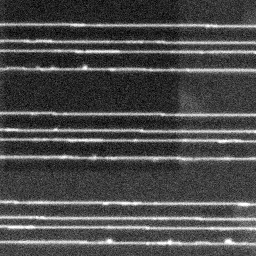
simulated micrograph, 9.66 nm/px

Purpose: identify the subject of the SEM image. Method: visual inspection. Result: lines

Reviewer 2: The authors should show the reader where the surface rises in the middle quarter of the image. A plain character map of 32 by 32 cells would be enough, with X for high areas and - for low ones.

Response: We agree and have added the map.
--------------------------------
XXXXXXXXXXXXXXXXXXXXX-----------
XXXXXXXXXXXXXXXXXXXXXXXXXXXXXXXX
XXXXXXXXXXXXXXXXXXXXXXXXXXXXXXXX
XXXXXXXXXXXXXXXXXXXXXXXXXXXXXXXX
XXXXXXXXXXXXXXXXXXXXXXXXXXXXXXXX
XXXXXXXXXXXXXXXXXXXXXXXXXXXXXXXX
XXXXXXXXXXXXXXXXXXXXXXXXXXXXXXXX
XXXXXXXXXXXXXXXXXXXXXXXXXXXXXXXX
XXXXXXXXXXXXXXXXXXXXXXXXXXXXXXXX
XXXXXXXXXXXXXXXXXXXXXXXXXXXXXXXX
XXXXXXXXXXXXXXXXXXXXXXXXXXXXXXXX
XXXXXXXXXXXXXXXXXXXXXXXXXXXXXXXX
--------------------------------
--------------------------------
--------------------------------
--------------------------------
XXXXXXXXXXXXXXXXXXXXXXXXXXXXXXXX
XXXXXXXXXXXXXXXXXXXXXXXXXXXXXXXX
--------------------------------
--------------------------------
--------------------------------
--------------------------------
XXXXXXXXXXXXXXXXXXXXXXXXXXXXXX--
XXXXXXXXXXXXXXXXXXXXXXXXXXXXXXXX
XXXXXXXXXXXXXXXXXXXXXXXXXXXXXXXX
XXXXXXXXXXXXXXXXXXXXXXXXXXXXXXXX
XXXXXXXXXXXXXXXXXXXXXXXXXXXXXXXX
XXXXXXXXXXXXXXXXXXXXXXXXXXXXXXXX
XXXXXXXXXXXXXXXXXXXXXXXXXXXXXXXX
XXXXXXXXXXXXXXXXXXXXXXXXXXXXXXXX
XXXXXXXXXXXXXXXXXXXXXXXXXXXXXXXX